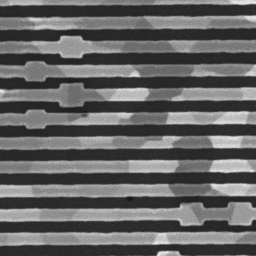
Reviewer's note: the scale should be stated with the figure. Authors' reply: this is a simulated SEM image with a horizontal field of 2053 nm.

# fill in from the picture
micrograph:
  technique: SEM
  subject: wiring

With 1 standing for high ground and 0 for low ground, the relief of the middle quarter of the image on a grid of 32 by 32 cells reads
11111111111111111111111111111111
11111111111111111111111111111111
11111111111111111111111111111111
00000000000000000000000000000000
00000000000000000000000000000000
11111000000000000000000000000000
11111111011111111111111111111111
11111111111111111111111111111111
11111111111111111111111111111111
11111000000000000000000000000000
11110000000000000000000000000000
00000000000000000000000000000000
11111111111111111111111111111111
11111111111111111111111111111111
11111111111111111111111111111111
00000000000000000000000000000000
00000000000000000000000000000000
00000000000000000000000000000000
11111111111111111111111111111111
11111111111111111111111111111111
11111111111111111111111111111111
00000000000000000000000000000000
00000000000000000000000000000000
00000000000000000000000000000000
11111111111111111111111111111111
11111111111111111111111111111111
11111111111111111111111111111111
00000000000000000000000000000000
00000000000000000000000000000000
00000000000000000000000000000000
11111111111111111111111111111111
11111111111111111111111111111111